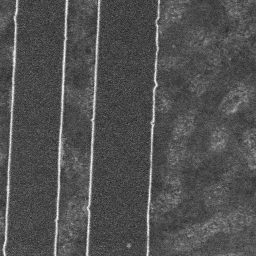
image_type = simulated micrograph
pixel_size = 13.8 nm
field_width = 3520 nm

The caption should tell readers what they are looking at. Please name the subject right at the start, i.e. one or a few lines or trenches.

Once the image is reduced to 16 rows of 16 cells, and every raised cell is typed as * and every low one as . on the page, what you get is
.***..****......
.***..****......
.***..****......
.***..****......
.***..****......
.***..****......
.***..****....*.
.***..****......
.***..****......
.***..***.......
.***..***.......
.***..***.......
****..***.......
****..***.......
****.****.......
***..****.......